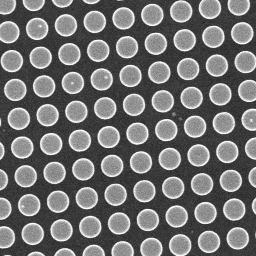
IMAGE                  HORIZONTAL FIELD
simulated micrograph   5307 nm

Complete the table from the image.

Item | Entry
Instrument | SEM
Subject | an array of small figures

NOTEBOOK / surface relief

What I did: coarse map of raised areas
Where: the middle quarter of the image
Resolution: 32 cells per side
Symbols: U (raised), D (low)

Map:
DDDDDDDDDDDDDDDDUUDDDDUUUUDDUUUU
DDDDDDDDUUUDDDUUUUUDDUUUUUDDUUUU
DUUUDDDUUUUUDDUUUUUDDUUUUUUDDUUU
UUUUUDDUUUUUDDUUUUUDDUUUUUDDDDUU
UUUUUDDUUUUUDDUUUUUDDDDUUDDDDDDD
UUUUUDDUUUUUDDDUUUDDDDDDDDDDDDDD
UUUUDDDDDUDDDDDDDDDDDDDDDDDDDDUU
DDDDDDDDDDDDDDDDDDDDDDDUUUUDDUUU
DDDDDDDDDDUDDDDUUUUUDDUUUUUDDUUU
DDUUDDDDUUUUUDDUUUUUDDUUUUUDDUUU
DUUUUDDDUUUUUDDUUUUUDDUUUUUDDDUU
UUUUUUDDUUUUUDDUUUUUDDDUUUDDDDDD
UUUUUUDDUUUUUDDDUUUDDDDDDDDDDDDD
DUUUUDDDDUUDDDDDDDDDDDDDDDDDDDDU
DDUUDDDDDDDDDDDDDDDDDDDDUUUUDDUU
DDDDDDDDDDDDDDDDUUUUDDDUUUUUDDUU
DDDDDDDDDUUUUDDDUUUUUDDUUUUUDDUU
DDUUUUDDDUUUUUDDUUUUUDDUUUUUDDDU
DUUUUUUDDUUUUUDDUUUUUDDDUUUDDDDD
DUUUUUUDDUUUUUDDUUUUDDDDDDDDDDDD
DDUUUUDDDUUUUDDDDDDDDDDDDDDDDDDD
DDDUUUDDDDDDDDDDDDDDDDDDDUUUDDDU
DDDDDDDDDDDDDDDDDDUUUDDDUUUUUDDU
DDDDDDDDDDUUUUDDDUUUUUDDUUUUUDDU
DDDUUUUDDDUUUUUDDUUUUUDDUUUUUDDU
DDUUUUUDDUUUUUUDDUUUUUDDUUUUDDDD
DDUUUUUUDDUUUUDDDUUUUDDDDDDDDDDD
DDUUUUUDDDUUUUDDDDDDDDDDDDDDDDDD
DDDUUUUDDDDDDDDDDDDDDDDDDDUUUDDD
DDDDDDDDDDDDDDDDDDDUUUDDDUUUUUDD
DDDDDDDDDDDUUUDDDDUUUUUDDUUUUUDD
DDDDUUUDDDUUUUUDDUUUUUUDDUUUUUDD